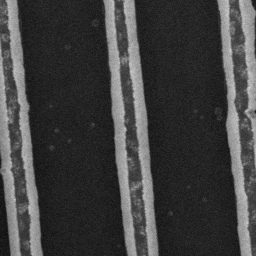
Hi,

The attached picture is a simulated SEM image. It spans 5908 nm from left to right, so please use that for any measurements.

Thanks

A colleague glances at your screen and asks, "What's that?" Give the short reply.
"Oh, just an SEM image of one or a few lines or trenches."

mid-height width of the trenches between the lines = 92.3 pixels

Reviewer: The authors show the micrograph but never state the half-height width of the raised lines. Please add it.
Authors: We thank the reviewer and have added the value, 0.534 micrometres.